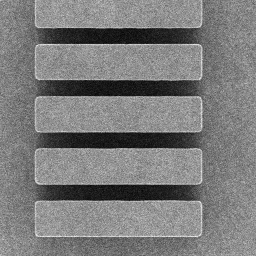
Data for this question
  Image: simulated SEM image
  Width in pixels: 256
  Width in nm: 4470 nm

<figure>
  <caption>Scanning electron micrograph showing groups of lines, slits or small figures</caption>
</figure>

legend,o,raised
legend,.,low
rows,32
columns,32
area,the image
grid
....ooooooooooooooooooooo.......
....ooooooooooooooooooooo.......
....ooooooooooooooooooooo.......
.....ooo.ooooooooooooooo........
................................
................................
....ooooooooooooooooooooo.......
....ooooooooooooooooooooo.......
....ooooooooooooooooooooo.......
....ooooooooooooooooooooo.......
................................
................................
....ooooooooooooooooooooo.......
....ooooooooooooooooooooo.......
....ooooooooooooooooooooo.......
....ooooooooooooooooooooo.......
................................
................................
................................
....ooooooooooooooooooooo.......
....ooooooooooooooooooooo.......
....ooooooooooooooooooooo.......
....ooooooooooooooooooooo.......
................................
................................
....ooooooooooooooooooooo.......
....ooooooooooooooooooooo.......
....ooooooooooooooooooooo.......
....ooooooooooooooooooooo.......
.....oooooooooooooooooooo.......
................................
................................